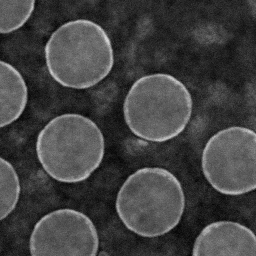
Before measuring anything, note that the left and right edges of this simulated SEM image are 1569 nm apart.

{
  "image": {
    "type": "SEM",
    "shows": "raised bodies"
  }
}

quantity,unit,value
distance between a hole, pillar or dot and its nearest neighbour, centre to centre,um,0.576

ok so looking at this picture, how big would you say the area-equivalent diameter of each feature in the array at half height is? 0.407 µm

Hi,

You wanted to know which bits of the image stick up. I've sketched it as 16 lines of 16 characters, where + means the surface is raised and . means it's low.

++..............
+...++..........
...++++.........
...++++.........
+..++++.........
++......++++....
++......++++....
+..+++..++++....
...+++...++..+++
..++++.......+++
+..+++.......+++
+.......+++..+++
+......++++.....
...++...+++.....
..++++..++...+++
..++++......++++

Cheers